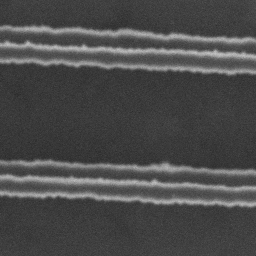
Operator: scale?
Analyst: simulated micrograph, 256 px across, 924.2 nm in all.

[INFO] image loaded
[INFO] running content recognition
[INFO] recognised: lines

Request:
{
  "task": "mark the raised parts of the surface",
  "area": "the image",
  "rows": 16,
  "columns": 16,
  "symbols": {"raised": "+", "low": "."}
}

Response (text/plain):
................
................
++++++++++++++..
++++++++++++++++
.............+++
................
................
................
................
................
+++++++++.......
++++++++++++++++
.........+++++++
................
................
................